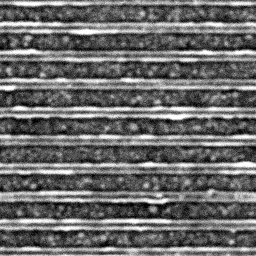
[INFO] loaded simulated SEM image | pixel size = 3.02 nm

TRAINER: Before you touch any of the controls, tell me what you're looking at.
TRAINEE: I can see parallel lines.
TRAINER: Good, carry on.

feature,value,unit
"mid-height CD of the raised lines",0.0291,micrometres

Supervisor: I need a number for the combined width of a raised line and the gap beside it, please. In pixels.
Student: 28.1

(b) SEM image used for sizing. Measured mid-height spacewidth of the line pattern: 55.5 nm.